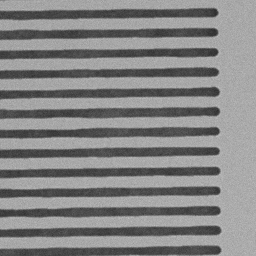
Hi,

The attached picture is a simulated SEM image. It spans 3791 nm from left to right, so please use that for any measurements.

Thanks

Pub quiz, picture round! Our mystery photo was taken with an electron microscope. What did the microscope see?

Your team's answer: groups of lines, slits or small figures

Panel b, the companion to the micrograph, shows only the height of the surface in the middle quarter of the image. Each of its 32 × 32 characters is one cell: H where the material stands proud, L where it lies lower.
HHHHHHHHHHHHHHHHHHHHHHHHHHHHHHHH
LLLLLLLLLLLLLLLLLLLLLLLLLLLLLLLL
LLLLLLLLLLLLLLLLLLLLLLLLLLLLLLLL
LLLLLHHHHHHHHHHHHHHHHHHHHHHHHHHH
HHHHHHHHHHHHHHHHHHHHHHHHHHHHHHHH
HHHHHHHHHHHHHHHHHHHHHHHHHHHHHHHH
LLLLLLLLLLLLLLLLLLLLLLLLLLLLLLLL
LLLLLLLLLLLLLLLLLLLLLLLLLLLLLLLL
LLLLLLLLLLLLLLLHHHHHHHHHHHHHHHHH
HHHHHHHHHHHHHHHHHHHHHHHHHHHHHHHH
HHHHHHHHHHHHHHHHHHHHHHHHHHHHHHHH
LLLLLLLLLLLLLLLLLLLLLLLLLLLLLLLL
LLLLLLLLLLLLLLLLLLLLLLLLLLLLLLLL
LLLLLLLLLLLLLLLLLLLLLHHHLLLLHHHH
HHHHHHHHHHHHHHHHHHHHHHHHHHHHHHHH
HHHHHHHHHHHHHHHHHHHHHHHHHHHHHHHH
LLLLLLLLLLLLLLLLLLLLLLLLLLLLLLLL
LLLLLLLLLLLLLLLLLLLLLLLLLLLLLLLL
HHHHHLLLLLHHHHHHHHHHHHHHHHHHHHHH
HHHHHHHHHHHHHHHHHHHHHHHHHHHHHHHH
HHHHHHHHHHHHHHHHHHHHHHHHHHHHHHHH
LLLLLLLLLLLLLLLLLLLLLLLLLLLLLLLL
LLLLLLLLLLLLLLLLLLLLLLLLLLLLLLLL
LLLLLHHHHHHHHHHHHHHHHHHHHHHHHHHH
HHHHHHHHHHHHHHHHHHHHHHHHHHHHHHHH
HHHHHHHHHHHHHHHHHHHHHHHHHHHHHHHH
LLLLLLLLLLLLLLLLLLLLLLLLLLLLLLLL
LLLLLLLLLLLLLLLLLLLLLLLLLLLLLLLL
LLHHHLLHHHHHHHHHHHHHHHHHHHHHHHHH
HHHHHHHHHHHHHHHHHHHHHHHHHHHHHHHH
HHHHHHHHHHHHHHHHHHHHHHHHHHHHLLLL
LLLLLLLLLLLLLLLLLLLLLLLLLLLLLLLL